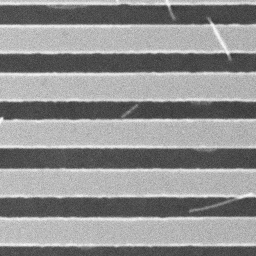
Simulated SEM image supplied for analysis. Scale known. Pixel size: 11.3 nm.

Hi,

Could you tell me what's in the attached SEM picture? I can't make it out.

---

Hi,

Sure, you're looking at lines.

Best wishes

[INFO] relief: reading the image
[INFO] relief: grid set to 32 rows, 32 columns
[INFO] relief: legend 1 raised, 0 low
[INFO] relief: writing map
11111111111111101111111111111111
00000000000000000000000000000000
00000000000000000000000000000000
11111111111111111111111111111111
11111111111111111111111111111111
11111111111111111111111111111111
11111111111111111111111111111111
00000000000000000000000000000000
00000000000000000000000000000000
11111111111111111111111111111111
11111111111111111111111111111111
11111111111111111111111111111111
11111111111111111111111111111111
00000000000000000000000000000000
00000000000000000000000000000000
11111111111111111111111111111111
11111111111111111111111111111111
11111111111111111111111111111111
00000000000000000000000000000000
00000000000000000000000000000000
00000000000000000000000000000000
11111111111111111111111111111111
11111111111111111111111111111111
11111111111111111111111111111111
11111111111111111111111111111111
00000000000000000000000000000000
00000000000000000000000000000000
11111111111111111111111111111111
11111111111111111111111111111111
11111111111111111111111111111111
11111111111111111111111111111111
00000000000000000000000000000000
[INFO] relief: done